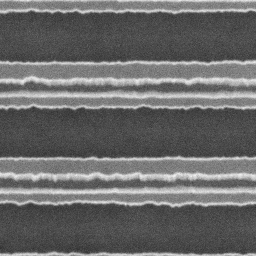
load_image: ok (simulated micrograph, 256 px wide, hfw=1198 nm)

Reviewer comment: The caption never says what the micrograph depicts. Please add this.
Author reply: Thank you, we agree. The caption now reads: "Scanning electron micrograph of lines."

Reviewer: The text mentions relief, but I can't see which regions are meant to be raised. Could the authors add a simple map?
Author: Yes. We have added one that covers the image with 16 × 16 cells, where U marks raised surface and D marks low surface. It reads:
UUUUUUUUUUUUUUUU
DDDDDDDDDDDDDDDD
DDDDDDDDDDDDDDDD
DDDDDDDDDDDDDDDD
UUUUUUUUUUUUUUUU
UUUUUUUUUUUUUUUU
UUUUUUUUUUUUUUUU
DDDDDDDDDDDDDDDD
DDDDDDDDDDDDDDDD
DDDDDDDDDDDDDDDD
UUUUUUUUUUUUUUUU
UUUUUUUUUUUUUUUU
UUUUUUUUUUUUUUUU
DDDDDDDDDDDDDDDD
DDDDDDDDDDDDDDDD
DDDDDDDDDDDDDDDD